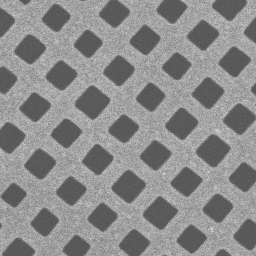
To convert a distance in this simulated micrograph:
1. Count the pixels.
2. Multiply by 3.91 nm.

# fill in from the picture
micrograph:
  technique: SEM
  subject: a regular array of holes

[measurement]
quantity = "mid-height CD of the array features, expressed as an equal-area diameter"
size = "104 nm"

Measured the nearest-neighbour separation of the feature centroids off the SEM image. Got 159 nanometres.